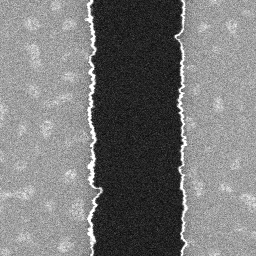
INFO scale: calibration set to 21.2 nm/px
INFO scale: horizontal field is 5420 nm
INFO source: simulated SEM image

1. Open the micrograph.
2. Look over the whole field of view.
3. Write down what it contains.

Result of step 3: one or a few lines or trenches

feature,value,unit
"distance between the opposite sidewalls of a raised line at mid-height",92.5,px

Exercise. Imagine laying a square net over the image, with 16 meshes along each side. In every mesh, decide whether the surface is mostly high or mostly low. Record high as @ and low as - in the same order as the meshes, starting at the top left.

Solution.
------@@@@@@----
------@@@@@-----
------@@@@@-----
------@@@@@-----
------@@@@@-----
------@@@@@-----
------@@@@@-----
------@@@@@-----
------@@@@@-----
------@@@@@-----
------@@@@@-----
------@@@@@-----
------@@@@@@----
------@@@@@@----
------@@@@@-----
------@@@@@@----